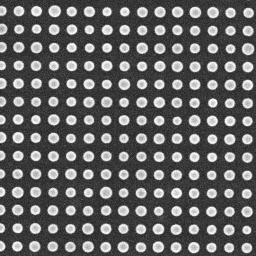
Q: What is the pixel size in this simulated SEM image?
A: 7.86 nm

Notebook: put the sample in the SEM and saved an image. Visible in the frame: a regular array of raised bodies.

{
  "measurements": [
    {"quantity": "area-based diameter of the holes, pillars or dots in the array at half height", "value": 74.8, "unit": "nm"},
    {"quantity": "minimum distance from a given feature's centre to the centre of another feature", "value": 138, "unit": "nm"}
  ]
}